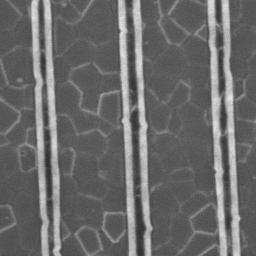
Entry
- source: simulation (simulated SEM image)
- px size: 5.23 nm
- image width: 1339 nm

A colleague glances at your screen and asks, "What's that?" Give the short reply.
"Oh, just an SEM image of one or a few lines or trenches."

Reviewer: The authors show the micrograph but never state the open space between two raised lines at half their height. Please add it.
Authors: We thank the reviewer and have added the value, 379 nanometres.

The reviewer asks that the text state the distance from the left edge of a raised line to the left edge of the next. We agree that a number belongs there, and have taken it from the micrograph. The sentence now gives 0.464 um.